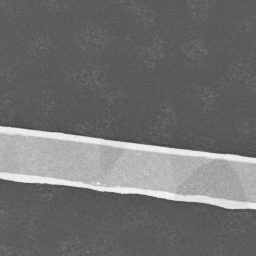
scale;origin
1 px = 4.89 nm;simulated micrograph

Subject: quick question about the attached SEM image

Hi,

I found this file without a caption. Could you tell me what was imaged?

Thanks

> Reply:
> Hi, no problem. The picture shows one or a few lines or trenches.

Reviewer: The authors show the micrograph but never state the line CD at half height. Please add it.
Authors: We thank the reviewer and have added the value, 230 nanometers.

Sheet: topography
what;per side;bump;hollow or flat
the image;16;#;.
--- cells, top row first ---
................
................
................
................
................
................
................
................
####............
############....
################
....############
.............###
................
................
................